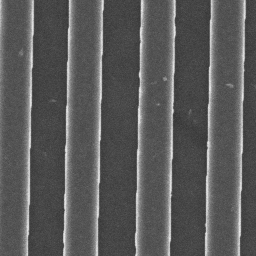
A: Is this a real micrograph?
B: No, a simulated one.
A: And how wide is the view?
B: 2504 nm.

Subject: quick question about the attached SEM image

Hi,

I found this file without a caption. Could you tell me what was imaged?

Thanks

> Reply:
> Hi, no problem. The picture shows lines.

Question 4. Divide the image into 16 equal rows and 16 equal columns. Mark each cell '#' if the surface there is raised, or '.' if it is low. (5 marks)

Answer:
##..##...##..##.
##..##...##..##.
##..##...##..##.
##..##...##..##.
##..##...##..##.
##..##...##..##.
##..##...##..##.
##..##...##..##.
##..##...##..##.
##..##...##..##.
##..##...##..##.
##..##...##..##.
##..##...##..##.
##..##...##..##.
##..##..###..##.
##..##..###..##.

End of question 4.